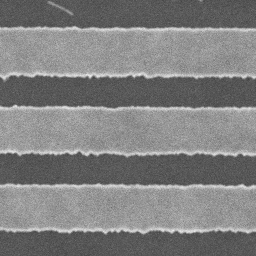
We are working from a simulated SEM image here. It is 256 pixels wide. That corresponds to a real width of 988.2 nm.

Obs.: lines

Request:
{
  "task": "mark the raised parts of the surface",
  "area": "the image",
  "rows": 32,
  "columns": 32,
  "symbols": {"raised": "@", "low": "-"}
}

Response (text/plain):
--------------------------------
--------------------------------
--------------------------------
@@@@@@@@@@-@@-@@@@--@@@@-@@@-@--
@@@@@@@@@@@@@@@@@@@@@@@@@@@@@@@@
@@@@@@@@@@@@@@@@@@@@@@@@@@@@@@@@
@@@@@@@@@@@@@@@@@@@@@@@@@@@@@@@@
@@@@@@@@@@@@@@@@@@@@@@@@@@@@@@@@
@@@@@@@@@@@@@@@@@@@@@@@@@@@@@@@@
@--@---@@@@@@@@@--@@@@@@@@@@@@@@
--------------------------------
--------------------------------
--------------------------------
@@@@@@@@@@@@@@-@@@@@@@@@-@@@@@@@
@@@@@@@@@@@@@@@@@@@@@@@@@@@@@@@@
@@@@@@@@@@@@@@@@@@@@@@@@@@@@@@@@
@@@@@@@@@@@@@@@@@@@@@@@@@@@@@@@@
@@@@@@@@@@@@@@@@@@@@@@@@@@@@@@@@
@@@@@@@@@@@@@@@@@@@@@@@@@@@@@@@@
-------------------------------@
--------------------------------
--------------------------------
--------------------------------
@@@@@@@@@@@@@@@@@@@@@@@@@@@@@@@@
@@@@@@@@@@@@@@@@@@@@@@@@@@@@@@@@
@@@@@@@@@@@@@@@@@@@@@@@@@@@@@@@@
@@@@@@@@@@@@@@@@@@@@@@@@@@@@@@@@
@@@@@@@@@@@@@@@@@@@@@@@@@@@@@@@@
@@@@@@@@@@@@@@@@@@@@@@@@@@@@@@@@
--------------------------------
--------------------------------
--------------------------------